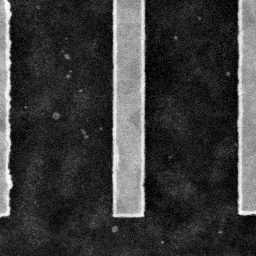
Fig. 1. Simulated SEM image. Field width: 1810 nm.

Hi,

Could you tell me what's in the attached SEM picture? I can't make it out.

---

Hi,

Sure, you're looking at one or a few lines or trenches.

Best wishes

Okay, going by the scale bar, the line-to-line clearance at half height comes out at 99.9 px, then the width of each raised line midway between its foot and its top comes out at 205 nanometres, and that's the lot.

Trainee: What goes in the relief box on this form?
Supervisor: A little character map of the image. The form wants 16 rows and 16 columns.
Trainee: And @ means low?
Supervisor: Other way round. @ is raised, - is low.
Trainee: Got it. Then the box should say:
@------@@------@
-------@@------@
@------@@------@
@------@@------@
@------@@------@
@------@@------@
@------@@------@
@------@@------@
@------@@------@
@------@@------@
@------@@------@
@------@@------@
@------@@------@
----------------
----------------
----------------